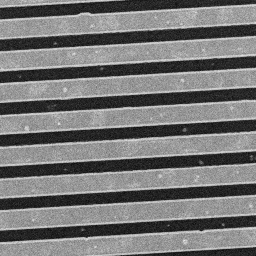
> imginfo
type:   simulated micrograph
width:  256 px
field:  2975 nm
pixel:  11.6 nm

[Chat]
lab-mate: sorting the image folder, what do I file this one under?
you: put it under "parallel lines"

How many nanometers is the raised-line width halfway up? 216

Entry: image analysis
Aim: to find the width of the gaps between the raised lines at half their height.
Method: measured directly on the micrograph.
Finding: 0.155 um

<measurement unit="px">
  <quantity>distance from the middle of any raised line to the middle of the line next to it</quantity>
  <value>31.8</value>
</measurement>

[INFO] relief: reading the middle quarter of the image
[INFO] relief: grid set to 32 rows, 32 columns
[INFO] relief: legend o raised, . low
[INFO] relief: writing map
ooo.............................
................................
............................oooo
........oo.ooooooooooooooooooooo
oooooooooooooooooooooooooooooooo
oooooooooooooooooooooooooooooooo
oooooooooooooooooooooooooooooooo
oooooooooooooooooo..............
oo..............................
................................
..........................oooooo
...........ooooooooooooooooooooo
oooooooooooooooooooooooooooooooo
oooooooooooooooooooooooooooooooo
oooooooooooooooooooooooooooooooo
ooooooooooooooo.................
................................
................................
........................oooooooo
........oooooooooooooooooooooooo
oooooooooooooooooooooooooooooooo
oooooooooooooooooooooooooooooooo
ooooooooooooooooooooooooooooooo.
ooooooooooooooo.................
................................
................................
........................oooooooo
.......ooooooooooooooooooooooooo
oooooooooooooooooooooooooooooooo
oooooooooooooooooooooooooooooooo
ooooooooooooooooooooooooooooooo.
ooooooooooooooo.................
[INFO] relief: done